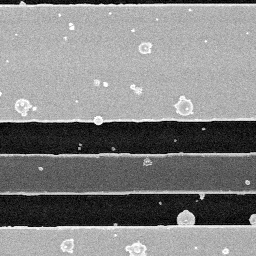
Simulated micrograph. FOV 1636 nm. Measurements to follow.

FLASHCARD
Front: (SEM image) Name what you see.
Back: lines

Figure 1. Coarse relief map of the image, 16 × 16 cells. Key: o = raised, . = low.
oooooooooooooooo
oooooooooooooooo
oooooooooooooooo
oooooooooooooooo
oooooooooooooooo
oooooooooooooooo
oooooooooooooooo
oooooooooooooooo
................
................
oooooooooooooooo
oooooooooooooooo
................
................
oooooooooooooooo
oooooooooooooooo